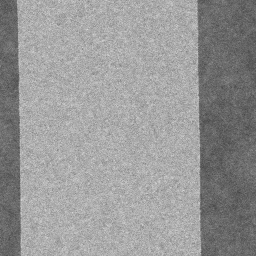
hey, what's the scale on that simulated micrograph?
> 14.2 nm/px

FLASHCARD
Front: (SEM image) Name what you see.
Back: one or a few lines or trenches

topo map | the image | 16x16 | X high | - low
-XXXXXXXXXXX----
-XXXXXXXXXXX----
-XXXXXXXXXXX----
-XXXXXXXXXXX----
-XXXXXXXXXXX----
-XXXXXXXXXXX----
-XXXXXXXXXXX----
-XXXXXXXXXXX----
-XXXXXXXXXXX----
-XXXXXXXXXXX----
-XXXXXXXXXXX----
-XXXXXXXXXXX----
-XXXXXXXXXXX----
-XXXXXXXXXXX----
-XXXXXXXXXXX----
-XXXXXXXXXXXX---